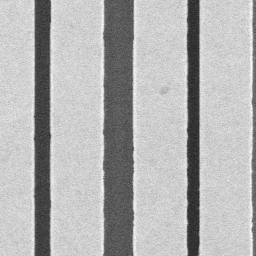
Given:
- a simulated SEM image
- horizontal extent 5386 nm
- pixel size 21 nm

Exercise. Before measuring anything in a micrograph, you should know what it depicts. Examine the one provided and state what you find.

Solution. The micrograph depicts lines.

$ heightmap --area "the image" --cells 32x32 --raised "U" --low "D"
UUUUDDUUUUUUUDDDDUUUUUUDDUUUUUUD
UUUUDDUUUUUUUDDDDUUUUUUDDUUUUUUD
UUUUDDUUUUUUUDDDDUUUUUUDDUUUUUUD
UUUUDDUUUUUUUDDDDUUUUUUDDUUUUUUD
UUUUDDUUUUUUUDDDDUUUUUUDDUUUUUUD
UUUUDDUUUUUUUDDDDUUUUUUDDUUUUUUD
UUUUDDUUUUUUUDDDDUUUUUUDDUUUUUUD
UUUUDDUUUUUUUDDDDUUUUUUDDUUUUUUD
UUUUDDUUUUUUUDDDDUUUUUUDDUUUUUUD
UUUUDDUUUUUUUDDDDUUUUUUDDUUUUUUD
UUUUDDUUUUUUUDDDDUUUUUUDDUUUUUUD
UUUUDDUUUUUUUDDDDUUUUUUDDUUUUUUD
UUUUDDUUUUUUUDDDDUUUUUUDDUUUUUUD
UUUUDDUUUUUUUDDDDUUUUUUDDUUUUUUD
UUUUDDUUUUUUUDDDDUUUUUUDDUUUUUUD
UUUUDDUUUUUUUDDDDUUUUUUDDUUUUUUD
UUUUDDUUUUUUUDDDDUUUUUUDDUUUUUUD
UUUUDDUUUUUUUDDDDUUUUUUDDUUUUUUD
UUUUDDUUUUUUUDDDDUUUUUUDDUUUUUUD
UUUUDDUUUUUUUDDDDUUUUUUDDUUUUUUD
UUUUDDUUUUUUUDDDDUUUUUUDDUUUUUUD
UUUUDDUUUUUUUDDDDUUUUUUDDUUUUUUD
UUUUDDUUUUUUUDDDDUUUUUUDDUUUUUUD
UUUUDDUUUUUUUDDDDUUUUUUDDUUUUUUD
UUUUDDUUUUUUUDDDDUUUUUUDDUUUUUUD
UUUUDDUUUUUUUDDDDUUUUUUDDUUUUUUD
UUUUDDUUUUUUUDDDDUUUUUUDDUUUUUUD
UUUUDDUUUUUUUDDDDUUUUUUDDUUUUUUD
UUUUDDUUUUUUUDDDDUUUUUUDDUUUUUUD
UUUUDDUUUUUUUDDDDUUUUUUDDUUUUUUD
UUUUDDUUUUUUUDDDDUUUUUUDDUUUUUUD
UUUUDDUUUUUUUDDDDUUUUUUDDUUUUUUD